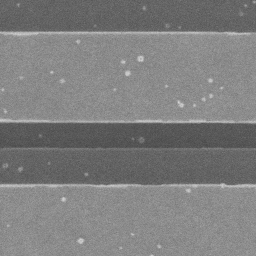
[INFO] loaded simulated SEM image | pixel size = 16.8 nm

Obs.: lines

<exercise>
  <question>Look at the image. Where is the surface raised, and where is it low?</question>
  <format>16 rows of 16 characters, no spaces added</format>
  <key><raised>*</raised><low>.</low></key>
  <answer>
................
................
****************
****************
****************
****************
****************
****************
................
................
................
................
****************
****************
****************
****************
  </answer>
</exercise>